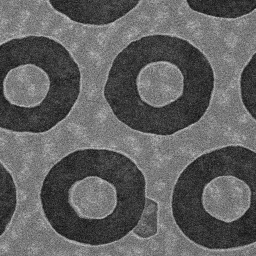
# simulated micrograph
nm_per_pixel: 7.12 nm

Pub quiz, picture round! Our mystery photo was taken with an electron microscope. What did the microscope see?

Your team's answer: ring-shaped grooves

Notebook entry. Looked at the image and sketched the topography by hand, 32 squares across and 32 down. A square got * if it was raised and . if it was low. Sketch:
******...........******.........
*******.........*********......*
*********......*****************
********************************
******************....**********
........********........********
.........******..........*******
.........*****............*****.
..***.....****....****....*****.
.*****....****...******....***..
******....***....******....***..
.*****....***....******....***..
.****.....***.....****....****..
.........*****............*****.
........******...........******.
.......*********........********
**...*************....**********
********************************
****************************...*
********........*********.......
*******..........*******........
.*****............*****.........
..***.....***.....****.....***..
..***....*****....****....*****.
..***....******...****...******.
..***....******.....*....******.
..***.....****......**....*****.
.*****..............**.....**...
.******.............**..........
********........*..****.........
***********..************......*
********************************